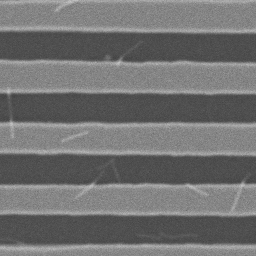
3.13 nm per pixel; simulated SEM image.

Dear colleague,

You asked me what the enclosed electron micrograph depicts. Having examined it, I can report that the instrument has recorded lines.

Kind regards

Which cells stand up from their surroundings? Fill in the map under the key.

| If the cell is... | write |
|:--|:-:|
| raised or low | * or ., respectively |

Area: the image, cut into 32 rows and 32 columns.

********************************
********************************
********************************
********************************
................................
................................
................................
................................
********************************
********************************
********************************
*********.**********************
................................
................................
................................
**************.*****************
********************************
********************************
********************************
................................
................................
................................
................................
********************************
********************************
********************************
********************************
................................
................................
................................
.......................**.......
********************************